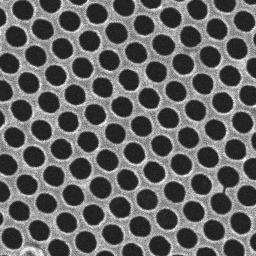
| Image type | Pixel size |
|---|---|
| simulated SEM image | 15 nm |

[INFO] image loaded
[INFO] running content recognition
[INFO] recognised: a regular array of holes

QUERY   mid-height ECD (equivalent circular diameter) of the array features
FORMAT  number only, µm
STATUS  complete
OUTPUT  0.325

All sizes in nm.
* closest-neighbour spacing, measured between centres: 412